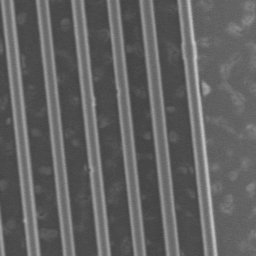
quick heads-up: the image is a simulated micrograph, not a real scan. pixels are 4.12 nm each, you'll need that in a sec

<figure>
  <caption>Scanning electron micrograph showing parallel lines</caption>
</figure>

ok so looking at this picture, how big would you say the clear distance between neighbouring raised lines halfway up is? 101 nanometers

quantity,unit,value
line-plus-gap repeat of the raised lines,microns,0.145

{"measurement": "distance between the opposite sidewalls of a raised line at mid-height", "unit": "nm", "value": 46.6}